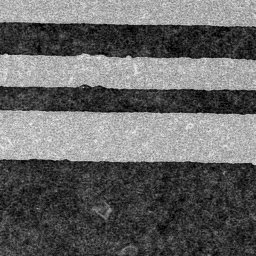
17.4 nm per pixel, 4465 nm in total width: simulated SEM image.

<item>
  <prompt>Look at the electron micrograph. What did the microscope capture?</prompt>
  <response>one or a few lines or trenches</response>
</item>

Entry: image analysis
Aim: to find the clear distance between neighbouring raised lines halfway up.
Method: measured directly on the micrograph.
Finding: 31.7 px